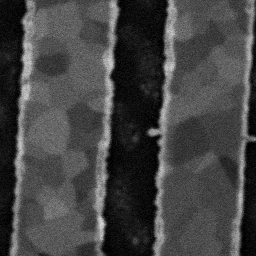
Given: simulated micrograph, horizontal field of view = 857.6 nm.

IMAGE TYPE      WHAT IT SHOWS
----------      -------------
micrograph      one or a few lines or trenches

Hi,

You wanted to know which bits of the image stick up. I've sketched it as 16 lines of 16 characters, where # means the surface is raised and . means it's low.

..#####....#####
..#####...######
..#####...######
..#####...######
.######...#####.
.######...#####.
.######...#####.
.######...#####.
.######...#####.
.######...#####.
.######...#####.
.######...#####.
.#####....#####.
.#####....#####.
.#####....#####.
.#####....#####.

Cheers